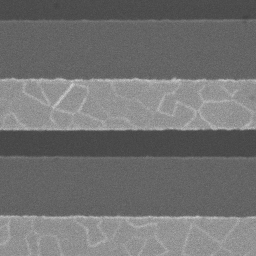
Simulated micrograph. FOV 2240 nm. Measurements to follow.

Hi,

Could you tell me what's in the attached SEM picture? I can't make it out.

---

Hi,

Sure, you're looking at lines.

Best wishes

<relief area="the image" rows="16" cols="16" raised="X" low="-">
----------------
XXXXXXXXXXXXXXXX
XXXXXXXXXXXXXXXX
XXXXXXXXXXXXXXXX
XXXXXXXXXXXXXXXX
XXXXXXXXXXXXXXXX
XXXXXXXXXXXXXXXX
XXXXXXXXXXXXXXXX
----------------
----------------
XXXXXXXXXXXXXXXX
XXXXXXXXXXXXXXXX
XXXXXXXXXXXXXXXX
XXXXXXXXXXXXXXXX
XXXXXXXXXXXXXXXX
XXXXXXXXXXXXXXXX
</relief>